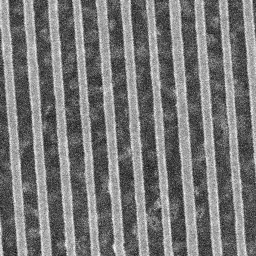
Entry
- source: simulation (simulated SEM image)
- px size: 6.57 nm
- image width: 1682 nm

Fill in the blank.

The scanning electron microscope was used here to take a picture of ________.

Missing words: parallel lines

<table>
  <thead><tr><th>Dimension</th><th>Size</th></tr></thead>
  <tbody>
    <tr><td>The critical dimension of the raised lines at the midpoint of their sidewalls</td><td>54.8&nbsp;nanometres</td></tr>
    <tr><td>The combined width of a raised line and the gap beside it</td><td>160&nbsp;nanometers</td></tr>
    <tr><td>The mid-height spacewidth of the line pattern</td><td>106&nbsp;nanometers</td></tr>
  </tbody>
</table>